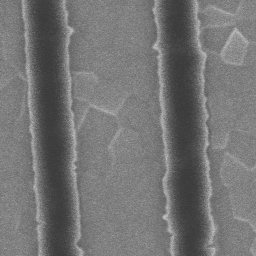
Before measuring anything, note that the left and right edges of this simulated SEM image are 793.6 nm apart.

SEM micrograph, one or a few lines or trenches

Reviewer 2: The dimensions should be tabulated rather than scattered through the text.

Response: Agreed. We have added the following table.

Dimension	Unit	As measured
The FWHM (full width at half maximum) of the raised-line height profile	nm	134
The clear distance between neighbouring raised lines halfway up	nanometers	274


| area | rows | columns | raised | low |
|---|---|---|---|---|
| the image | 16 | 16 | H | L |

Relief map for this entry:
LHHHLLLLLLHHLLLL
LLHHLLLLLLHHLLLL
LLHHLLLLLLHHLLLL
LLHHLLLLLLHHHLLL
LLHHLLLLLLHHHLLL
LLHHLLLLLLHHHLLL
LLHHLLLLLLHHHLLL
LLHHHLLLLLHHHLLL
LLHHHLLLLLHHHLLL
LLHHHLLLLLHHHLLL
LLHHHLLLLLHHHLLL
LLHHHLLLLLHHHLLL
LLHHHLLLLLHHHLLL
LLHHHLLLLLHHHLLL
LLHHHLLLLLLHHLLL
LLHHHLLLLLLHHLLL